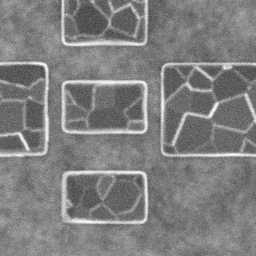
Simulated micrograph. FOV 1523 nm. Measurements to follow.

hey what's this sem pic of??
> wiring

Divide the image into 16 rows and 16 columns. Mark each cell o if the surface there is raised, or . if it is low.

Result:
....ooooo.......
....ooooo.......
....ooooo.......
................
ooo.......oooooo
ooo.ooooo.oooooo
ooo.ooooo.oooooo
ooo.ooooo.oooooo
ooo.......oooooo
ooo.......oooooo
................
....ooooo.......
....ooooo.......
....ooooo.......
................
................